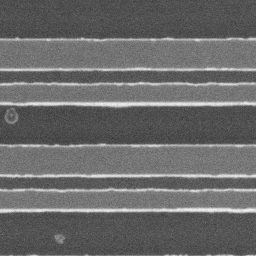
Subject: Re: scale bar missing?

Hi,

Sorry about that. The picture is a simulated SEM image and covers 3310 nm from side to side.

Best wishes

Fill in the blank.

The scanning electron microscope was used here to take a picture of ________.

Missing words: lines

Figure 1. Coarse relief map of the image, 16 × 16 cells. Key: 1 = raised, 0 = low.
0000000000000000
0000000000000000
1111111111111111
1111111111111111
1111111111111111
1111111111111111
0000000000000000
0000000000000000
0000000000000000
1111111111111111
1111111111111111
1111111111111111
1111111111111111
0000000000000000
0000000000000000
0000000000000000